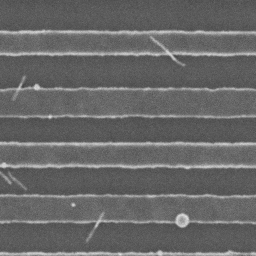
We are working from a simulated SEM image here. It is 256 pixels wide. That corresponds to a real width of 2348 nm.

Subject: lines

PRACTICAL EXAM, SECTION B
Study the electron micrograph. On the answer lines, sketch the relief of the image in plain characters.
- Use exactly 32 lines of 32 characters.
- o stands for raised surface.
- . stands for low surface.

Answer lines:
................................
................................
................................
................................
oooooooooooooooooooooooooooooooo
oooooooooooooooooooooooooooooooo
oooooooooooooooooooooooooooooooo
................................
................................
................................
................................
oooooooooooooooooooooooooooooooo
oooooooooooooooooooooooooooooooo
oooooooooooooooooooooooooooooooo
oooooooooooooooo..oooooooooooooo
................................
................................
................................
oooooooooooooooooooooooooooooooo
oooooooooooooooooooooooooooooooo
oooooooooooooooooooooooooooooooo
................................
................................
................................
ooooooooooooooooooooooooooo..ooo
oooooooooooooooooooooooooooooooo
oooooooooooooooooooooooooooooooo
oooooooooooooooooooooooooooooooo
................................
................................
................................
................................